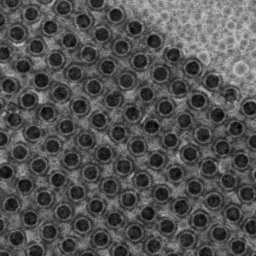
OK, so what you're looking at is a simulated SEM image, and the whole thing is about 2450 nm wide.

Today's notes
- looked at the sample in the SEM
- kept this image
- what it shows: a regular array of raised bodies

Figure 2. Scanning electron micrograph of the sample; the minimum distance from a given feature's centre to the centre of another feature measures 222 nm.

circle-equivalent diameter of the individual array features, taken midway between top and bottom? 151 nanometres